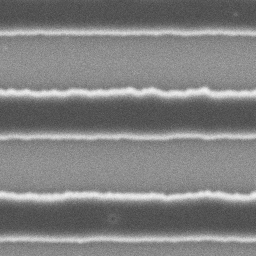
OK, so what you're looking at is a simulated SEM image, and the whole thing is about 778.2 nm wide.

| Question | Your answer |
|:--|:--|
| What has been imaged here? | lines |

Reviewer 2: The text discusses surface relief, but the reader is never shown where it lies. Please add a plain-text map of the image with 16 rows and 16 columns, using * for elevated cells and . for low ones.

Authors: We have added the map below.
****************
****************
................
................
................
................
****************
****************
****************
................
................
................
****************
****************
****************
................